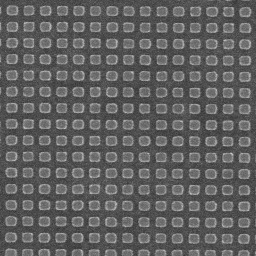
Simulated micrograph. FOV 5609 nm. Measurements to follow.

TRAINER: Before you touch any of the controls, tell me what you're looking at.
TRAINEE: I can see a regular array of raised bodies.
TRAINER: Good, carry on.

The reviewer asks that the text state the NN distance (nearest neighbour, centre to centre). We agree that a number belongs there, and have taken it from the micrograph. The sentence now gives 352 nm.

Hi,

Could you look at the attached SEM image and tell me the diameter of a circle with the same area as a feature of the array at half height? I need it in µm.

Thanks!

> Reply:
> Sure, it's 0.235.